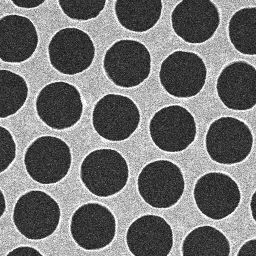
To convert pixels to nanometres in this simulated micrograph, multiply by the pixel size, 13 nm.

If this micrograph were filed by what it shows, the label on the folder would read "a regular array of holes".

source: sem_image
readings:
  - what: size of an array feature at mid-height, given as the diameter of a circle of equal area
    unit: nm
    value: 613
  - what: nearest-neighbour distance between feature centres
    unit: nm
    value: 723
